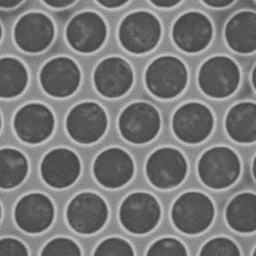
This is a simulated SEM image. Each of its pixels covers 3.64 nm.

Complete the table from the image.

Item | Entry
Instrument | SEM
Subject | a regular array of holes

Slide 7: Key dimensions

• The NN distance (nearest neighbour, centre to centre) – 190 nm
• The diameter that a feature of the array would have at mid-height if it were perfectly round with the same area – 151 nm